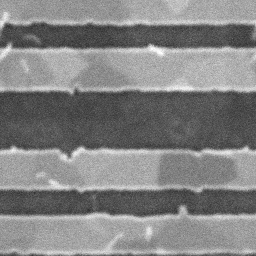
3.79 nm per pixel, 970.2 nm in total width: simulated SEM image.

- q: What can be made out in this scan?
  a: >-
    one or a few lines or trenches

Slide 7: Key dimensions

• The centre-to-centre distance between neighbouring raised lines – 0.313 um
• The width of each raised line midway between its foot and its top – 0.143 um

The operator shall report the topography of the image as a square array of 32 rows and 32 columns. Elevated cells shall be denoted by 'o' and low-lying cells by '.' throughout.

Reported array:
oooooooooooooooooooooooooooooooo
oooooooooooooooooooooooooooooooo
oooooooooooooooooooooooooooooooo
................................
................................
................................
oooooooooooooooooooooooooooooooo
oooooooooooooooooooooooooooooooo
oooooooooooooooooooooooooooooooo
oooooooooooooooooooooooooooooooo
oooooooooooooooooooooooooooooooo
................................
................................
................................
................................
................................
................................
................................
................................
oooooooo.ooooooooooooooooooooooo
oooooooooooooooooooooooooooooooo
oooooooooooooooooooooooooooooooo
oooooooooooooooooooooooooooooooo
o.ooo.ooooooooooooooo..ooo.ooooo
................................
................................
......................o.........
oooooooooooooooooooooooooooooooo
oooooooooooooooooooooooooooooooo
oooooooooooooooooooooooooooooooo
oooooooooooooooooooooooooooooooo
o.ooooooooooooooooooooooooo.oooo